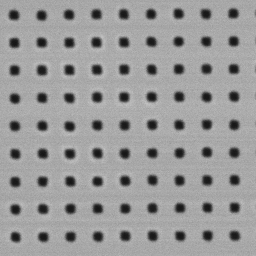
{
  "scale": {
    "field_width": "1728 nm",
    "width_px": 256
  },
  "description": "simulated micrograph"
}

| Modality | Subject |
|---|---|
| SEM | a regular array of holes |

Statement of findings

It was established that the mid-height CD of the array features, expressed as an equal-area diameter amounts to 74.2 nanometres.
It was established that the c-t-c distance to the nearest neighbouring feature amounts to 184 nanometres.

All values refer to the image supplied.